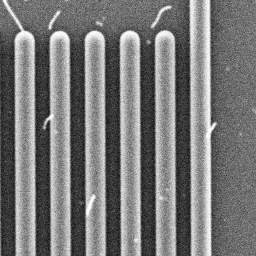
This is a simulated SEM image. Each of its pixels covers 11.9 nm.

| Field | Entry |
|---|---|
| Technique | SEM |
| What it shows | groups of lines, slits or small figures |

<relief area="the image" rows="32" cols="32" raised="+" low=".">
........................++......
........................++......
........................++......
........................++......
..++...+...++..++...++..++......
..++..+++..++..++...++..++......
..++..+++..++..++...++..++......
..++..+++..++..++...++..++......
..++..+++..++..++...++..++......
..++..+++..++..++...++..++......
..++..+++..++..++...++..++......
..++..+++..++..++...++..++......
..++..+++..++..++...++..++......
..++..+++..++..++...++..++......
..++..+++..++..++...++..++......
..++..+++..++..++...++..++......
..++..+++..++..++...++..++......
..++..+++..++..++...++..++......
..++..+++..++..++...++..++......
..++..+++..++..++...++..++......
..++..+++..++..++...++..++......
..++..+++..++..++...++..++......
..++..+++..++..++...++..++......
..++..+++..++..++...++..++......
..++..+++..++..++...++..++......
..++..+++..++..++...++..++......
..++..+++..++..++...++..++......
..++..+++..++..++...++..++......
..++..+++..++..++...++..++......
..++..+++..++..++...++..++......
..++..+++..++..++...++..++......
..++..+++..++..++...++..++......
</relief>